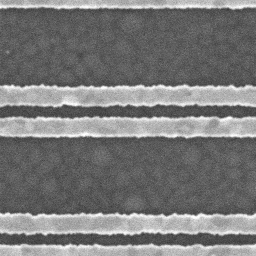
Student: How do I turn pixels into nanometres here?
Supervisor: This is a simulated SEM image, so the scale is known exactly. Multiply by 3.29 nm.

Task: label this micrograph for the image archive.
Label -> lines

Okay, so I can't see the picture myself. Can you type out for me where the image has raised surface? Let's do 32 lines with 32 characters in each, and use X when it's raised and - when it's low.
XXXXXXXXXXXXXXXXXXXXXXXXXXXXXXXX
--------------------------------
--------------------------------
--------------------------------
--------------------------------
--------------------------------
--------------------------------
--------------------------------
--------------------------------
--------------------------------
--------------------------------
XXXXXXXXXXXXXXXXXXXXXXXXXXXXXXXX
XXXXXXXXXXXXXXXXXXXXXXXXXXXXXXXX
--------------------------------
--------------------------------
XXXXXXXXXXXXXXXXXXXXXXXXXXXXXXXX
XXXXXXXXXXXXXXXXXXXXXXXXXXXXXXXX
--------------------------------
--------------------------------
--------------------------------
--------------------------------
--------------------------------
--------------------------------
--------------------------------
--------------------------------
--------------------------------
--------------------------------
XXXXXXXXXXXXXXXXXXXXXXXXXXXXXXXX
XXXXXXXXXXXXXXXXXXXXXXXXXXXXXXXX
--------------------------------
--------------------------------
XXXXXXXXXXXXXXXXXXXXXXXXXXXXXXXX